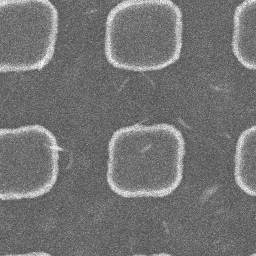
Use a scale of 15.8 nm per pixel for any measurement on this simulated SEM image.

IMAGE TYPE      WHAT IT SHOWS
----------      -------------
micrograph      raised bodies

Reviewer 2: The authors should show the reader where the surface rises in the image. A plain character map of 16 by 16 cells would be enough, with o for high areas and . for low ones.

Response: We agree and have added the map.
ooo....oooo....o
ooo....oooo....o
ooo....oooo....o
ooo....oooo....o
................
................
................
................
ooo....oooo....o
ooo....oooo....o
ooo....oooo....o
ooo....oooo....o
................
................
................
................